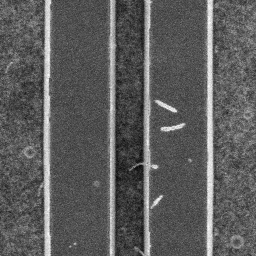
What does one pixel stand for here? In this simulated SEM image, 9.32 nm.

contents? one or a few lines or trenches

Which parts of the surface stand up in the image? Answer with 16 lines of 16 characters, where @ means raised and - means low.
---@@@@--@@@@---
---@@@@--@@@@---
---@@@@--@@@@---
---@@@@--@@@@---
---@@@@--@@@@---
---@@@@--@@@@---
---@@@@--@@@@---
---@@@@--@@@@---
---@@@@--@@@@---
---@@@@--@@@@---
---@@@@--@@@@---
---@@@@--@@@@---
---@@@@--@@@@---
---@@@@--@@@@---
---@@@@--@@@@---
---@@@@--@@@@---